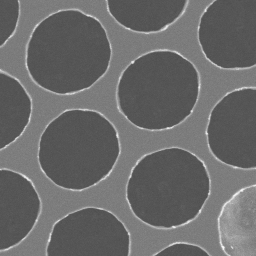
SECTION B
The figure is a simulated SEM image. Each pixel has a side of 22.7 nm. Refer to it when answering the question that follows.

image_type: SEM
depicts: holes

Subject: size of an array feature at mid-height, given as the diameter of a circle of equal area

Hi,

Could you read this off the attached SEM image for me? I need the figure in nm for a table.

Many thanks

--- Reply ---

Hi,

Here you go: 1820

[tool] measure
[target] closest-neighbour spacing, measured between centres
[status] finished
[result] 2220 nm